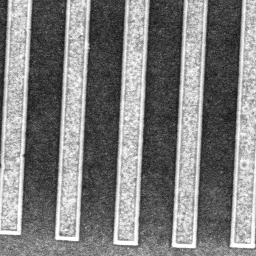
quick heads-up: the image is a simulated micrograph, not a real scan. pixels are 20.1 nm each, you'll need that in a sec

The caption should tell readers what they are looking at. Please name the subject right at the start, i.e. parallel lines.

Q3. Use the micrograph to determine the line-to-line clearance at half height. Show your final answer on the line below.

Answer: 746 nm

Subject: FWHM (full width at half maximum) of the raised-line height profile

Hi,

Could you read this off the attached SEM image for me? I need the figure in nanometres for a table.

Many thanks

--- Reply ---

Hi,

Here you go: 421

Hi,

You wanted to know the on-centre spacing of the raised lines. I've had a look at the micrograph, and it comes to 58.5 px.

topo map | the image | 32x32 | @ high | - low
-@@@-----@@-----@@-----@@@----@@
-@@@----@@@-----@@-----@@@----@@
-@@@----@@@-----@@-----@@@----@@
-@@@----@@@-----@@-----@@@----@@
-@@@----@@@-----@@-----@@@----@@
-@@@----@@@-----@@-----@@-----@@
-@@@----@@@-----@@-----@@-----@@
-@@-----@@@----@@@-----@@-----@@
-@@-----@@@----@@@-----@@-----@@
-@@-----@@@----@@@-----@@-----@@
-@@-----@@@----@@@-----@@-----@@
-@@-----@@@----@@@-----@@-----@@
-@@-----@@-----@@@-----@@-----@@
-@@-----@@-----@@@-----@@-----@@
@@@-----@@-----@@@-----@@-----@@
@@@-----@@-----@@@----@@@-----@@
@@@-----@@-----@@@----@@@-----@@
@@@-----@@-----@@@----@@@-----@@
@@@-----@@-----@@@----@@@-----@@
@@@-----@@-----@@@----@@@-----@@
@@@-----@@-----@@-----@@@----@@@
@@@-----@@-----@@-----@@@----@@@
@@@----@@@-----@@-----@@@----@@@
@@@----@@@-----@@-----@@@----@@@
@@@----@@@-----@@-----@@@----@@@
@@@----@@@-----@@-----@@@----@@@
@@@----@@@-----@@-----@@-----@@@
@@-----@@@----@@@-----@@-----@@@
@@-----@@@----@@@-----@@-----@@@
-------@@@----@@@-----@@-----@@@
----------------------@@-----@@@
--------------------------------